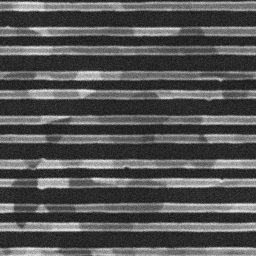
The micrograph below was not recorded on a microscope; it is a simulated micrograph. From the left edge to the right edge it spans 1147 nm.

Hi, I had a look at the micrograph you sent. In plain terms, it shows parallel lines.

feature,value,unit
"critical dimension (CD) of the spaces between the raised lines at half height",76.8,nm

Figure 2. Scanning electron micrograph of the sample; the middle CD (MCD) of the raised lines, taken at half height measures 6.87 px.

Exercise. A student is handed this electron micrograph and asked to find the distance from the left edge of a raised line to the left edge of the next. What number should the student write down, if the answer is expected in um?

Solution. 0.0993